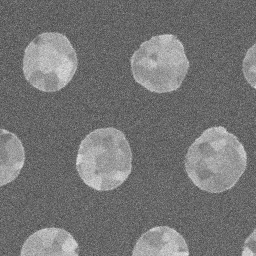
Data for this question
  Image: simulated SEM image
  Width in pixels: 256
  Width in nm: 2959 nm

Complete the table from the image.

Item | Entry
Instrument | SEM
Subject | raised bodies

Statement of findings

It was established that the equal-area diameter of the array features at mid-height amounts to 652 nanometres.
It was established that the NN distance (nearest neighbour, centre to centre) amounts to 1280 nm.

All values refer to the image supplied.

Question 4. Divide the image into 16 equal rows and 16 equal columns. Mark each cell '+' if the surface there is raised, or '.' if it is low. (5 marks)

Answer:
................
................
..++.....++.....
..+++...++++...+
..+++...++++...+
..++.....++.....
................
................
+.....++.....+..
+....+++....+++.
+....+++....+++.
......+.....+++.
................
................
..++.....++.....
.++++...++++...+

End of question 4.